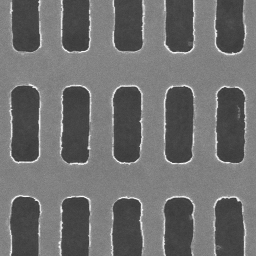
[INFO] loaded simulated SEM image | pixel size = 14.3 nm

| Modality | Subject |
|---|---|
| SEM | holes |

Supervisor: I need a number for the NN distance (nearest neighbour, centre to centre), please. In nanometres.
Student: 730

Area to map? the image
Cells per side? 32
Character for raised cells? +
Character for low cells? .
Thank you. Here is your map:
+....+++...+++....+++...+++...++
++...+++...+++....+++...+++...++
+....+++...+++....+++...+++...++
++...+++...+++....+++...+++....+
++...+++...+++....+++...+++....+
++...+++...+++....+++...+++....+
+++.++++++++++++++++++++++++..++
++++++++++++++++++++++++++++++++
++++++++++++++++++++++++++++++++
++++++++++++++++++++++++++++++++
++++++++++++++++++++++++++++++++
+....+++...+++...++++...+++...++
+....+++...+++....+++...+++....+
+....+++...+++....+++...+++....+
+....+++...+++....+++...+++....+
+....+++...+++....+++...+++....+
+....+++...+++....+++...+++....+
+....+++...+++....+++...+++....+
+....+++...+++...++++...+++....+
+....+++...+++...++++...+++...++
++++++++++++++++++++++++++++++++
++++++++++++++++++++++++++++++++
++++++++++++++++++++++++++++++++
++++++++++++++++++++++++++++++++
++++++++++++++++++++++++++++++++
++...+++...+++....+++...+++...++
+....+++...+++....++....+++...++
+....+++...+++...++++...+++...++
+....+++...+++....+++...+++...++
+....+++...+++....+++...+++....+
+....+++...+++....+++...+++....+
+....+++...+++....+++...+++....+